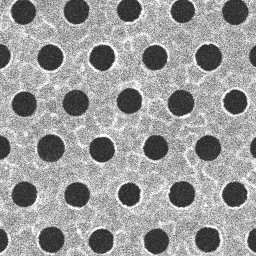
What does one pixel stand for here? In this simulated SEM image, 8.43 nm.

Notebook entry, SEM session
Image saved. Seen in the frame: a regular array of holes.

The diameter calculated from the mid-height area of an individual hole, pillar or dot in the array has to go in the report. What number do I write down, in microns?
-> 0.218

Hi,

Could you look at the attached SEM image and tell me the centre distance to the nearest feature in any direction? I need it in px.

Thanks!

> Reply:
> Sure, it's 51.5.